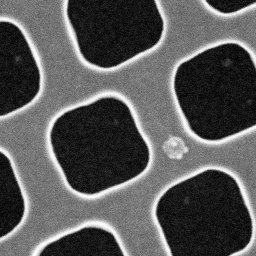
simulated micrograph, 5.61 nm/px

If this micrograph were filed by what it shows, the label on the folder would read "holes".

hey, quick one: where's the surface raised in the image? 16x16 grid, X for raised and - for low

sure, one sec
XXXX------XXX--X
-XXX------XXXXXX
--XXX-----XXXXXX
--XXX---XXXX----
--XXXXXXXXX-----
--XXXXXXXXX-----
--XXX---XXX-----
XXXX----XXXX----
XXX------XXX--XX
XXX------XXXXXXX
-XXX-----XXXXXXX
-XXX----XXX----X
-XXXXXXXXX-----X
-XXXXXXXXX------
-XXXX--XXX------
XXX-----XXX----X